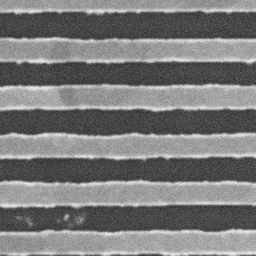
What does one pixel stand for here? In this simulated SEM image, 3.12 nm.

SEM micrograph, lines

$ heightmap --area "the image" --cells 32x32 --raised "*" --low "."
********************************
................................
................................
................................
................................
********************************
********************************
*********************.**********
................................
................................
................................
********************************
********************************
***..****...*****.****.********.
................................
................................
................................
********************************
********************************
********************.*****......
................................
................................
................................
********************************
********************************
*********************...........
................................
................................
................................
********************************
********************************
********************************